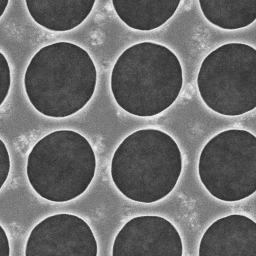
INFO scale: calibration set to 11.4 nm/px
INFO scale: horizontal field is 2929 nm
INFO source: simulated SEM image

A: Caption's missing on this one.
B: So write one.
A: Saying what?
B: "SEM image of holes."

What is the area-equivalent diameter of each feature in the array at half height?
0.828 micrometres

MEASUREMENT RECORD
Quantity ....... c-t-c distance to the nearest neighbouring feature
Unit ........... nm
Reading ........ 979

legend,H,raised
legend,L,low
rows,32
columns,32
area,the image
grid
LHHLLLLLLLLLHHLLLLLLLLHHHLLLLLLL
HHHHLLLLLLLHHHHLLLLLLLHHHLLLLLLL
HHHHLLLLLLHHHHHLLLLLLHHHHHLLLLLL
HHHHHHLLLHHHHHHHLLLLHHHHHHHHLLHH
HHHHHHHHHHHHHHHHHHHHHHHHHHHHHHHH
HHHHHHHLLHHHHHHHHLLLHHHHHHHHLLLH
HHHHHLLLLLLHHHHLLLLLLHHHHHHLLLLL
LHHHLLLLLLLHHHHLLLLLLLHHHLLLLLLL
LHHLLLLLLLLLHHLLLLLLLLLHHLLLLLLL
LHHLLLLLLLLLHHLLLLLLLLLHHLLLLLLL
LHHLLLLLLLLLHHLLLLLLLLLHHLLLLLLL
LHHLLLLLLLLLHHLLLLLLLLHHHLLLLLLL
LHHHLLLLLLLHHHLLLLLLLLHHHLLLLLLL
HHHHLLLLLLHHHHHLLLLLLHHHHHLLLLLL
HHHHHHLLHHHHHHHHHHLHHHHHHHHHHHHH
HHHHHHHHHHHHHHHHHHHHHHHHHHHHHHHH
HHHHHHHLLHHHHHHHHLLLHHHHHHHHLLLH
HHHHHLLLLLLHHHHLLLLLLLHHHHLLLLLL
LHHHLLLLLLLHHHHLLLLLLLHHHLLLLLLL
LHHHLLLLLLLLHHLLLLLLLLLHHLLLLLLL
LHHLLLLLLLLLHHLLLLLLLLLHHLLLLLLL
LHHLLLLLLLLLHHLLLLLLLLLHHLLLLLLL
LHHHLLLLLLLHHHLLLLLLLLHHHLLLLLLL
HHHHLLLLLLLHHHHLLLLLLLHHHHLLLLLL
HHHHHLLLLLHHHHHHLLLLLHHHHHHLLLLH
HHHHHHHHHHHHHHHHHHHHHHHHHHHHHHHH
HHHHHHHHHHHHHHHHHHHHHHHHHHHHHHHH
HHHHHLLLLLHHHHHHLLLLLHHHHHHLLLLL
HHHHLLLLLLLHHHHLLLLLLLHHHHLLLLLL
LHHHLLLLLLLLHHHLLLLLLLLHHLLLLLLL
LHHLLLLLLLLLHHLLLLLLLLLHHLLLLLLL
LHHLLLLLLLLLHHLLLLLLLLLHHLLLLLLL